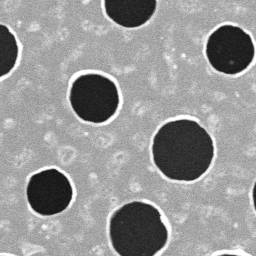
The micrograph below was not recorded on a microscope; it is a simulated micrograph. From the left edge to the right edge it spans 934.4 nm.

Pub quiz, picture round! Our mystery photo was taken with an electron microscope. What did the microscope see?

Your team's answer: holes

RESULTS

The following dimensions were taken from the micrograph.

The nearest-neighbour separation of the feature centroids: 377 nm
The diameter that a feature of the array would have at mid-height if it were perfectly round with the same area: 176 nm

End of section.